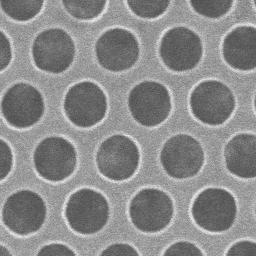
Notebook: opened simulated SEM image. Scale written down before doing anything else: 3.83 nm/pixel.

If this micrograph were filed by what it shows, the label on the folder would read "a regular array of holes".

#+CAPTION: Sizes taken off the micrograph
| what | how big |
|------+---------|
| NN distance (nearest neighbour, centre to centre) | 0.236 µm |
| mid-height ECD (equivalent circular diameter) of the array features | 0.17 µm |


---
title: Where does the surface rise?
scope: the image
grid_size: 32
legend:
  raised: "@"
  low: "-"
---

-----@@@-----@@@-----@@@-----@@@
-----@@@-----@@@@---@@@@@---@@@@
@@--@@@@@@-@@@@@@@@@@@@@@@@@@@@@
@@@@@@@@@@@@@@-@@@@@@@--@@@@@---
-@@@@----@@@@----@@@-----@@@----
-@@@-----@@@-----@@@-----@@@----
-@@@-----@@@-----@@@-----@@@----
-@@@-----@@@-----@@@-----@@@----
-@@@@----@@@@---@@@@@---@@@@@---
@@@@@@@@@@@@@@@@@@@@@@@@@@@@@@@@
@@--@@@@@@--@@@@@---@@@@@---@@@@
@----@@@-----@@@-----@@@-----@@@
-----@@@-----@@@-----@@@-----@@@
------@@-----@@@-----@@@-----@@@
-----@@@-----@@@@----@@@-----@@@
@---@@@@@---@@@@@@--@@@@@@--@@@@
@@@@@@@@@@@@@@@@@@@@@@@@@@@@@@@@
@@@@@---@@@@@---@@@@@----@@@@---
-@@@-----@@@-----@@@-----@@@----
--@@------@@-----@@@-----@@@----
-@@@------@@-----@@@-----@@@----
-@@@@----@@@@----@@@@----@@@@---
@@@@@@--@@@@@@--@@@@@@@@@@@@@@@@
@@@@@@@@@@@@@@@@@@-@@@@@@@@@@@@@
@----@@@@----@@@@----@@@@----@@@
@-----@@-----@@@------@@------@@
------@@------@@------@@------@@
------@@-----@@@-----@@@-----@@@
@----@@@@----@@@@----@@@@----@@@
@@@@@@@@@@@@@@@@@@@@@@@@@@@@@@@@
@@@@@@--@@@@@@@-@@@@@@--@@@@@---
-@@@@----@@@@----@@@@----@@@----